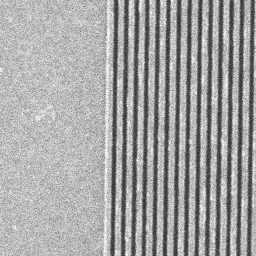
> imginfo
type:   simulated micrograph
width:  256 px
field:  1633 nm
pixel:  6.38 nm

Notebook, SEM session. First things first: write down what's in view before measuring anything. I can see parallel lines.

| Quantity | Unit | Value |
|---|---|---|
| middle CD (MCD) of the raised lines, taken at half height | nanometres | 43.1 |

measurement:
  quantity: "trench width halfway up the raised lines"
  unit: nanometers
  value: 24.7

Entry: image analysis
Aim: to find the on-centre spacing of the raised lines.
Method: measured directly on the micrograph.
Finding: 67.1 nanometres